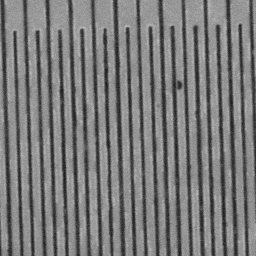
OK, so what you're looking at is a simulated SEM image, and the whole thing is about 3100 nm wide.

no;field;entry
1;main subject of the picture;parallel lines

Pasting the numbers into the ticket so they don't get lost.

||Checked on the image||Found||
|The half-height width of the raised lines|78.7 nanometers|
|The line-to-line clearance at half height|0.056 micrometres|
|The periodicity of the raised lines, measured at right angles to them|0.137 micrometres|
